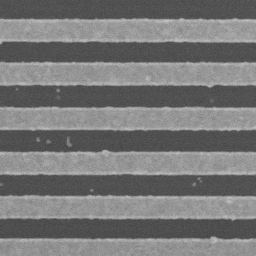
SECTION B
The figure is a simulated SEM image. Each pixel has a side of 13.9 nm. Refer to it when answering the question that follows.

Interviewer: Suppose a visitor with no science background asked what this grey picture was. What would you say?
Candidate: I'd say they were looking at lines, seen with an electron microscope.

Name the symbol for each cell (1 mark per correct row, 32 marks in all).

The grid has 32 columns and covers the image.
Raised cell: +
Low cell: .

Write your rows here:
................................
................................
++++++++++++++++++++++++++++++++
++++++++++++++++++++++++++++++++
++++++++++++++++++++++++++++++++
................................
................................
................................
++++++++++++++++++++++++++++++++
++++++++++++++++++++++++++++++++
++++++++++++++++++++++++++++++++
................................
................................
++....+......+..++..+..++.......
++++++++++++++++++++++++++++++++
++++++++++++++++++++++++++++++++
................................
................................
................................
++++++++++++++++++++++++++++++++
++++++++++++++++++++++++++++++++
++++++++++++++++++++++++++++++++
................................
................................
.+.++...........................
++++++++++++++++++++++++++++++++
++++++++++++++++++++++++++++++++
................................
................................
................................
++++++++++++++++++++++++++++++++
++++++++++++++++++++++++++++++++